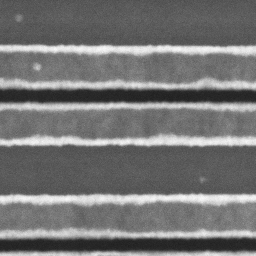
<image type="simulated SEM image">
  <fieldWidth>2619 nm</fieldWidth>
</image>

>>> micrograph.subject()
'lines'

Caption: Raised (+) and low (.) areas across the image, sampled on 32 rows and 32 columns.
................................
................................
................................
................................
................................
................................
++++++++++++++++++++++++++++++++
++++++++++++++++++++++++++++++++
++++++++++++++++++++++++++++++++
++++++++++++++++++++++++++++++++
++++++++++++++++++++++++++++++++
................................
................................
++++++++++++++++++++++++++++++++
++++++++++++++++++++++++++++++++
++++++++++++++++++++++++++++++++
++++++++++++++++++++++++++++++++
++++++++++++++++++++++++++++++++
................................
................................
................................
................................
................................
................................
......................+.........
++++++++++++++++++++++++++++++++
++++++++++++++++++++++++++++++++
++++++++++++++++++++++++++++++++
++++++++++++++++++++++++++++++++
++++++++++++++++++++++++++++++++
................................
.........................++.....